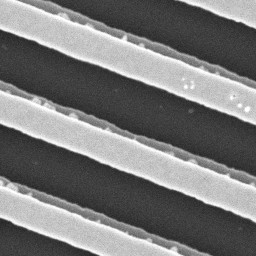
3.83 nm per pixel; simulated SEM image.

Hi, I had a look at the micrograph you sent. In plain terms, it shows lines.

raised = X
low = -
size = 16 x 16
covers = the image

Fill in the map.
XXXX---------XXX
XXXXXX---------X
--XXXXXXX-------
----XXXXXXXX----
-------XXXXXXX--
X---------XXXXXX
XXX----------XXX
XXXXXX---------X
--XXXXXXX-------
-----XXXXXXX----
-------XXXXXXX--
X---------XXXXXX
XXXX--------XXXX
XXXXXXX--------X
--XXXXXXX-------
-----XXXXXXX----